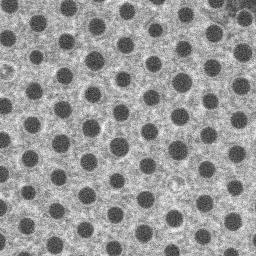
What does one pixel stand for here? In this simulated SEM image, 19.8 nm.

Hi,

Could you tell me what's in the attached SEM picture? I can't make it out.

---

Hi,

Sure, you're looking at a regular array of holes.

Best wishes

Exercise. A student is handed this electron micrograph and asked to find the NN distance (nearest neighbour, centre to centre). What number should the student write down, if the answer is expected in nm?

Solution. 667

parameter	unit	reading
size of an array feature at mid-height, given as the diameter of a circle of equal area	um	0.369